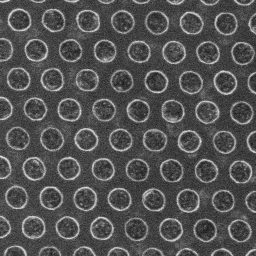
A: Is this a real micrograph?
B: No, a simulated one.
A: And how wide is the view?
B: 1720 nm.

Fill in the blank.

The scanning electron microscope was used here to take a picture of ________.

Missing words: a regular array of raised bodies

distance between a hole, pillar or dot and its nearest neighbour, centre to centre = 0.228 um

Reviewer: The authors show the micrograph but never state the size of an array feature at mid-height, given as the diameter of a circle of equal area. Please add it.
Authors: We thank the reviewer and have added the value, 150 nm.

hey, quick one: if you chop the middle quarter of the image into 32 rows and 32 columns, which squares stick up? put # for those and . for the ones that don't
................................
.....#..........................
...#####....####.....####.....##
...######...#####....####....###
...#####....#####...######...###
...#####....#####....#####...###
.....##......###.....####.....##
................................
................................
###.....####.....###.....####...
####...######...#####....#####..
####...######...#####....#####..
####...######...#####....#####..
###.....####.....####....####...
..........................##....
................................
....##.......##.................
...#####....####....#####....###
...#####....#####...#####....###
...#####....#####...#####....###
...#####....#####....####....###
.....##.......#.......##......##
................................
................................
###.....####.....###.....###....
####...#####....#####...#####...
####...######...#####...######..
####...#####....#####...######..
###.....####.....####....####...
................................
................................
....###.....###......##.........